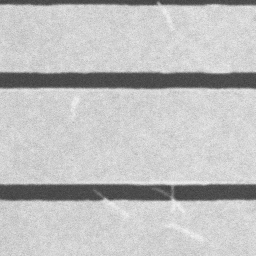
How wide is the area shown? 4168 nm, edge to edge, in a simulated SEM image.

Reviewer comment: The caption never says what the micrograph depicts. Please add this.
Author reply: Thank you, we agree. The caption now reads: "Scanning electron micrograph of lines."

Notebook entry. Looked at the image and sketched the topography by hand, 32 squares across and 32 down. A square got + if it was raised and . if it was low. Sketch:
................................
++++++++++++++++++++++++++++++++
++++++++++++++++++++++++++++++++
++++++++++++++++++++++++++++++++
++++++++++++++++++++++++++++++++
++++++++++++++++++++++++++++++++
++++++++++++++++++++++++++++++++
++++++++++++++++++++++++++++++++
++++++++++++++++++++++++++++++++
................................
................................
++++++++++++++++++++++++++++++++
++++++++++++++++++++++++++++++++
++++++++++++++++++++++++++++++++
++++++++++++++++++++++++++++++++
++++++++++++++++++++++++++++++++
++++++++++++++++++++++++++++++++
++++++++++++++++++++++++++++++++
++++++++++++++++++++++++++++++++
++++++++++++++++++++++++++++++++
++++++++++++++++++++++++++++++++
++++++++++++++++++++++++++++++++
++++++++++++++++++++++++++++++++
................................
................................
++++++++++++++++++++++++++++++++
++++++++++++++++++++++++++++++++
++++++++++++++++++++++++++++++++
++++++++++++++++++++++++++++++++
++++++++++++++++++++++++++++++++
++++++++++++++++++++++++++++++++
++++++++++++++++++++++++++++++++